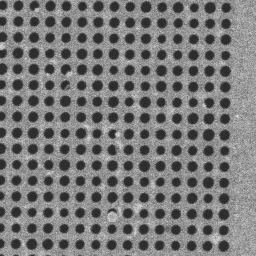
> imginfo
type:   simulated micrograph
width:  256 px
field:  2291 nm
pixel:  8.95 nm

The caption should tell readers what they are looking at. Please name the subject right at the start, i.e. a regular array of holes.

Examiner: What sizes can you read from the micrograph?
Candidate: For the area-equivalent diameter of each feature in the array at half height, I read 0.0915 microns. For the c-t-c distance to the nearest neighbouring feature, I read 0.141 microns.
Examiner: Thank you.